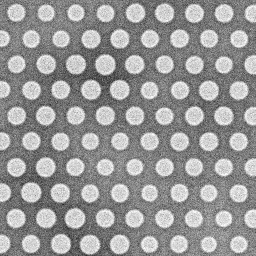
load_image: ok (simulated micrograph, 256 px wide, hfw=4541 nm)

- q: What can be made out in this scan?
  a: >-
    an array of small figures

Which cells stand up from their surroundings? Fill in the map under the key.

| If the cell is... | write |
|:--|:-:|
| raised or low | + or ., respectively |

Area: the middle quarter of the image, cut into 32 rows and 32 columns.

.++++...+++++...++++...++++....+
.++++...++++....+++.....+++....+
................................
................................
......++.....++.................
+....++++...++++....+++....++++.
+....++++...++++....+++....++++.
+....++++...++++....+++....++++.
......++.....++......+......++..
................................
................................
..++.....+++....+++.....++.....+
.++++...++++....++++...++++....+
.++++...++++....++++...++++....+
..++.....+++....+++.....++.....+
................................
................................
..............+......+......++..
+....+++....++++....+++....++++.
+....+++....++++....+++....++++.
+....+++.....+++....+++....++++.
................................
................................
................................
.+++.....+++....+++.....+++....+
.++++....+++....+++....++++....+
.++++....+++....+++....++++....+
..++......+......+......++.....+
................................
................................
......+......++.............++..
+....+++....++++....+++....++++.